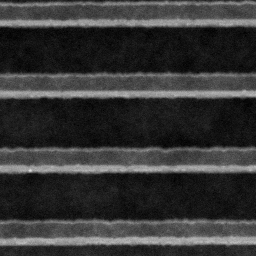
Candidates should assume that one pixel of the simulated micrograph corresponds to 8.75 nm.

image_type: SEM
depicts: lines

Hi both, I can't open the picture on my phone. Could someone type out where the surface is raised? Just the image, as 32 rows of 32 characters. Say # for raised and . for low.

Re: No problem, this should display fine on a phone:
....................#....#.##.##
################################
################################
................................
................................
................................
................................
................................
................................
.###############################
################################
################################
................................
................................
................................
................................
................................
................................
................................
################################
################################
................................
................................
................................
................................
................................
................................
................................
################################
################################
#####...........................
................................